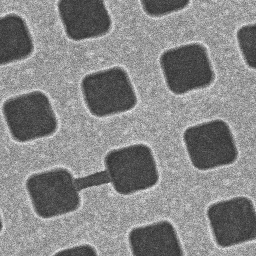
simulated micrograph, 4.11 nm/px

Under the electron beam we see holes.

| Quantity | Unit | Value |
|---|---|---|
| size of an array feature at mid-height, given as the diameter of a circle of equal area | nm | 208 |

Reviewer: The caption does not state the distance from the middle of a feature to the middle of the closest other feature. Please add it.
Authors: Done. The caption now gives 332 nanometres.